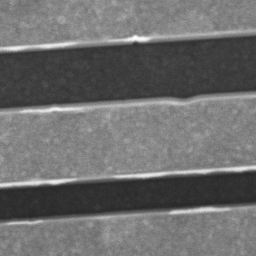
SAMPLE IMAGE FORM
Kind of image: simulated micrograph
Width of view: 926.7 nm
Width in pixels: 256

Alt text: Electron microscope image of one or a few lines or trenches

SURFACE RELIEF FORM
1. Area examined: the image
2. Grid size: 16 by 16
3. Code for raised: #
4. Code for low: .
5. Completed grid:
################
################
##########......
................
................
................
.......#########
################
################
################
################
####............
................
......##########
################
################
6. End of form